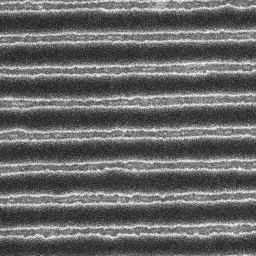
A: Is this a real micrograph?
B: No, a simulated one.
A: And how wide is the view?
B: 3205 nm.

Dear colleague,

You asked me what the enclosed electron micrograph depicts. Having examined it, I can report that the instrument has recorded parallel lines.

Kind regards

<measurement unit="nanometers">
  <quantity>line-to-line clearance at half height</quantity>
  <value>97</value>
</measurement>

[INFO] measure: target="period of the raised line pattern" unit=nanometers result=404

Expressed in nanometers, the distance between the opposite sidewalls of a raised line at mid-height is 314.